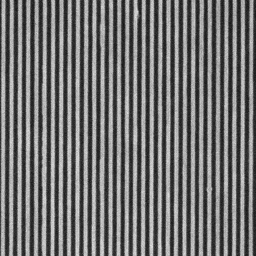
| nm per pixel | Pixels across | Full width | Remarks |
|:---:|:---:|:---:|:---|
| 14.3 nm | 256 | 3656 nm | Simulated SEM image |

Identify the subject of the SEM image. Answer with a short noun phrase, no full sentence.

parallel lines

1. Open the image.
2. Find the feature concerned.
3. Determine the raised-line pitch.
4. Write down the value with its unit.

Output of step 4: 118 nm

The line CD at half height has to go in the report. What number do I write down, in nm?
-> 48.2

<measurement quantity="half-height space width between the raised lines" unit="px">5.13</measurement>